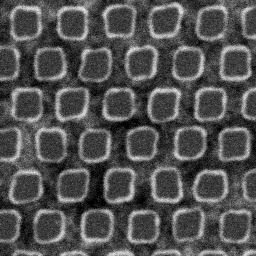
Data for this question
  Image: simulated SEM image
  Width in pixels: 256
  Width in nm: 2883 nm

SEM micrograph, a regular array of raised bodies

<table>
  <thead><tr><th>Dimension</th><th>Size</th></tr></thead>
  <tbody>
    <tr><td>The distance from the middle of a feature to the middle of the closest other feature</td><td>506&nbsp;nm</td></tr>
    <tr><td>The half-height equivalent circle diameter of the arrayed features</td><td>0.367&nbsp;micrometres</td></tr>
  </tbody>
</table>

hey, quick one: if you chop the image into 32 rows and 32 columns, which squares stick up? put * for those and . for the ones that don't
................................
..***...***..****..****..***...*
..***..****..****..***...***..**
.****..****..****..***...***..**
..***...***...**....*....***...*
................................
**...***...***..***...***...***.
**..****..****..***...***...***.
**...***..****..***...***...***.
**...***..****..***...***...***.
................................
..***...***...**...***...***...*
..***..****..****..***...***...*
..***..****..****..***...***..**
..***..***...***...***...***...*
................................
**...***...**...***...***...***.
**...***..****..****..****.****.
**...***..****..***...****.****.
**...***..***...***...***..****.
................................
..*.....***...**...***...**....*
..***..****..****..****..***..**
.****..****..****..****.****..**
.****..****..***...****..***...*
................................
**...**....***....*...***...***.
**..****..****..****..***...***.
**..****..****..****..***...***.
**..****..****..****..***...***.
................................
..*.................**....**...*